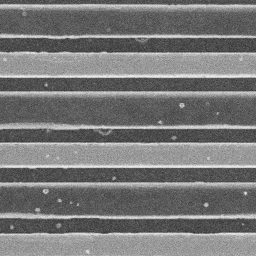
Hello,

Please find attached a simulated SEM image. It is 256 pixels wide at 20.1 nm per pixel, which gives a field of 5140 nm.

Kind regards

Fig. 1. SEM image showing lines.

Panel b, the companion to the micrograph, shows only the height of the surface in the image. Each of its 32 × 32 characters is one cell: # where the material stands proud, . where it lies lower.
................................
################################
################################
################################
################################
................................
................................
################################
################################
################################
................................
................................
################################
################################
################################
################################
................................
................................
################################
################################
################################
................................
................................
################################
################################
################################
################################
................................
................................
################################
################################
################################